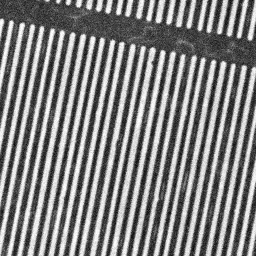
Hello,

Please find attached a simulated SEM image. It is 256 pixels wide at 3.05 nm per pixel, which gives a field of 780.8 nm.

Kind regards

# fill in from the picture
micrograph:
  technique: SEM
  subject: parallel lines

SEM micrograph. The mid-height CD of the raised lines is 13.1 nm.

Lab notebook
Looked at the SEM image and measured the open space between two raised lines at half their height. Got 18.7 nm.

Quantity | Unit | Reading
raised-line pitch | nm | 31.3